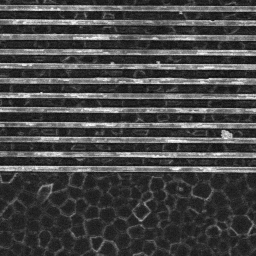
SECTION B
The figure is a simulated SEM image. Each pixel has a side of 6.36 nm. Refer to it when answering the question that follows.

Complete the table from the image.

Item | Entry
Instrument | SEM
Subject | parallel lines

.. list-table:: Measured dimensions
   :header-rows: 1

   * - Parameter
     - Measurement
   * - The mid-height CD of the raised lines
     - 0.0334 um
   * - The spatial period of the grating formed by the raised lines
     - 92.8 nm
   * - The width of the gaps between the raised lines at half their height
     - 61.2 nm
